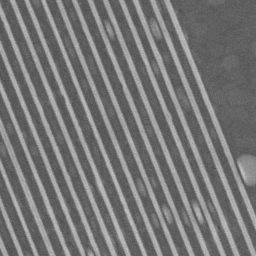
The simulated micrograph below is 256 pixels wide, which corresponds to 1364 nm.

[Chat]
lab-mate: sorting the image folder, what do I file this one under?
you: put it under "parallel lines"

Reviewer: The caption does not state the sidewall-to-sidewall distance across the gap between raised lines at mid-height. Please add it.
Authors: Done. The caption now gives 51.9 nm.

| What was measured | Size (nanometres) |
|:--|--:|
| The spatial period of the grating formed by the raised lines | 76.5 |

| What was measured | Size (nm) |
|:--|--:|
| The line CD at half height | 21.1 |